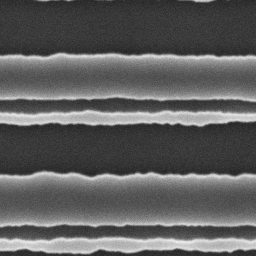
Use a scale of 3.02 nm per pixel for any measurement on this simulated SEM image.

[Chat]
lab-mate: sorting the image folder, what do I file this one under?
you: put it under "lines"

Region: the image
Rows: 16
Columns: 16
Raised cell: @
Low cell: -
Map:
----------------
----------------
----------------
---@@@@@-@------
@@@@@@@@@@@@@@@@
@@@@@@@@@@@@@@@@
@@@@@@@@@@@@@@@@
@@@@@@@@@@@@@@@@
----------------
----------------
----------------
@@@@@@@@@@@@@@@@
@@@@@@@@@@@@@@@@
@@@@@@@@@@@@@@@@
@@@@@@@@@@@@@@@@
@@@@@@@@@@@@@@@@